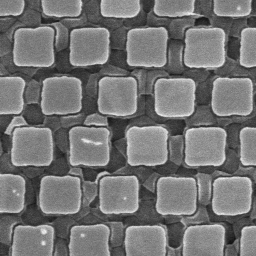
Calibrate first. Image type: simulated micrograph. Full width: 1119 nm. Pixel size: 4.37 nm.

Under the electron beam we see a regular array of raised bodies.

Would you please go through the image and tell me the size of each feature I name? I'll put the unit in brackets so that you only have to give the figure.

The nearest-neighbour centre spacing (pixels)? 55.8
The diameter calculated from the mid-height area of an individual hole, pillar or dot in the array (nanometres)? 187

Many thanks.